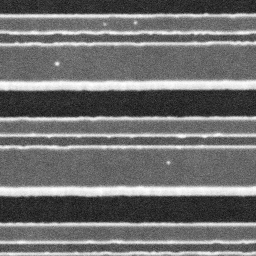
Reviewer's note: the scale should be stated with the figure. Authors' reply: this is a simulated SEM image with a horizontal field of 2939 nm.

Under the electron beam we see lines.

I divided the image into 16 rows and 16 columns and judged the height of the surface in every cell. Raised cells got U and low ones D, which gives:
DDDDDDDDDDDDDDDD
UUUUUUUUUUUUUUUU
UUUUUUUUUUUUUUUU
UUUUUUUUUUUUUUUU
UUUUUUUUUUUUUUUU
DDDDDDDDDDDDDDDD
DDDDDDDDDDDDDDDD
UUUUUUUUUUUUUUUU
UUUUUUUUUUUUUUUU
UUUUUUUUUUUUUUUU
UUUUUUUUUUUUUUUU
UUUUUUUUUUUUUUUU
DDDDDDDDDDDDDDDD
DDDDDDDDDDDDDDDD
UUUUUUUUUUUUUUUU
UUUUUUUUUUUUUUUU